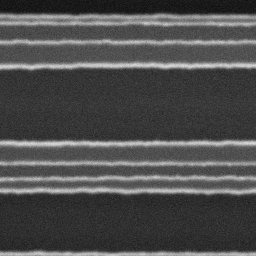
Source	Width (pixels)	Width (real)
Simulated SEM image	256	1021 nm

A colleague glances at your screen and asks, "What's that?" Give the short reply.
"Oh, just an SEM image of lines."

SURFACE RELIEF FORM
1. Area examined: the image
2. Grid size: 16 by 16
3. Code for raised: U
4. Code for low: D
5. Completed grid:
DDDDDDDDDDDDDDDD
UUUUUUUUUUUUUUUU
UUUUUUUUUUUUUUUU
UUUUUUUUUUUUUUUU
DDDDDDDDDDDDDDDD
DDDDDDDDDDDDDDDD
DDDDDDDDDDDDDDDD
DDDDDDDDDDDDDDDD
DDDDDDDDDDDDDDDD
UUUUUUUUUUUUUUUU
UUUUUUUUUUUUUUUU
UUUUUUUUUUUUUUUU
DDDDDDDDDDDDDDDD
DDDDDDDDDDDDDDDD
DDDDDDDDDDDDDDDD
DDDDDDDDDDDDDDDD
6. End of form